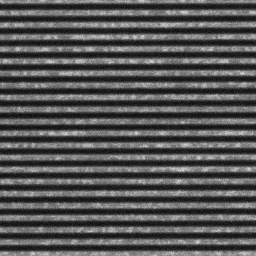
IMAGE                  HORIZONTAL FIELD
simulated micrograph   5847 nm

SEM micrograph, parallel lines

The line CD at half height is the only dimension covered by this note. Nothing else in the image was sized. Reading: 0.106 micrometres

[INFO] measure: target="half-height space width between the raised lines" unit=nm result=171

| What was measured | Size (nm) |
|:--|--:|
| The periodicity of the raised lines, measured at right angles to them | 276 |